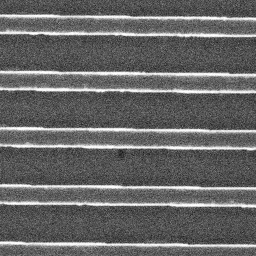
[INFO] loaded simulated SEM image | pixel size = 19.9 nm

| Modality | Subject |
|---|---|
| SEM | lines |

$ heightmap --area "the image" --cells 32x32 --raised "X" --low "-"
--------------------------------
--------------------------------
XXXXXXXXXXXXXXXXXXXXXXXXXXXXXXXX
XXXXXXXXXXXXXXXXXXXXXXXXXXXXXXXX
--------------------------------
--------------------------------
--------------------------------
--------------------------------
--------------------------------
XXXXXXXXXXXXXXXXXXXXXXXXXXXXXXXX
XXXXXXXXXXXXXXXXXXXXXXXXXXXXXXXX
------------------------XXXXXXXX
--------------------------------
--------------------------------
--------------------------------
--------------------------------
XXXXXXXXXXXXXXXXXXXXXXXXXXXXXXXX
XXXXXXXXXXXXXXXXXXXXXXXXXXXXXXXX
-----------------------XXXXXXXXX
--------------------------------
--------------------------------
--------------------------------
--------------------------------
XXXXXXXXXXXXXXXXXXXXXXX---------
XXXXXXXXXXXXXXXXXXXXXXXXXXXXXXXX
-----------XXXXXXXXXXXXXXXXXXXXX
--------------------------------
--------------------------------
--------------------------------
--------------------------------
XXXXXXXXX-----------------------
XXXXXXXXXXXXXXXXXXXXXXXXXXXXXXXX